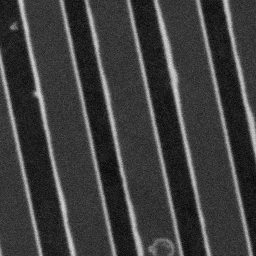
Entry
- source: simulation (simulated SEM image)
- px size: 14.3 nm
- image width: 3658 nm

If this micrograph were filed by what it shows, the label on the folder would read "lines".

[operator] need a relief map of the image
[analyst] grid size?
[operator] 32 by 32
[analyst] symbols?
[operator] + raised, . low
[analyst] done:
...+++++...+++++....+++++...++++
...+++++...+++++....+++++...++++
...+++++...++++++...+++++....+++
...++++++...+++++...++++++...+++
...++++++...+++++...++++++...+++
....+++++...+++++....+++++...+++
....+++++...++++++...+++++...+++
....+++++...++++++...+++++....++
....++++++...+++++...++++++...++
+...++++++...+++++....+++++...++
+....+++++...+++++....+++++...++
+....+++++...++++++...+++++...++
+....+++++...++++++...+++++....+
+....++++++...+++++...++++++...+
++...++++++...+++++...++++++...+
++....+++++...+++++....+++++...+
++....+++++...++++++...+++++....
++....++++++..++++++...+++++....
++....++++++...+++++...++++++...
+++...++++++...+++++....+++++...
+++....+++++...+++++....+++++...
+++....+++++...++++++...+++++...
+++....++++++..++++++...++++++..
+++....++++++...+++++...++++++..
++++....+++++...+++++....+++++..
++++....+++++...+++++....+++++..
++++....+++++...++++++...+++++..
++++....++++++...+++++...++++++.
++++....++++++...+++++...++++++.
+++++....+++++...+++++....+++++.
+++++....+++++...++++++...+++++.
+++++....+++++...++++++...+++++.